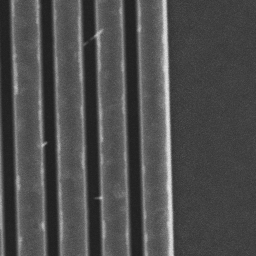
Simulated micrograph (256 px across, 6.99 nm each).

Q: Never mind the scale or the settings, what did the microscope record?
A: parallel lines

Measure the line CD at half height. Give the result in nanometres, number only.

196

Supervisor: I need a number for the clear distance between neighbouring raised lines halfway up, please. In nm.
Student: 97.8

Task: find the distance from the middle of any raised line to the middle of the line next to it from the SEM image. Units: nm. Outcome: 293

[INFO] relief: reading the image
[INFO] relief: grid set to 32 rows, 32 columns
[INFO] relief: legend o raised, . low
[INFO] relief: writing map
.oooo..ooo..ooo..oooo...........
.oooo..ooo..ooo..oooo...........
.oooo..ooo..ooo..oooo...........
..ooo..ooo..ooo..oooo...........
..ooo..ooo..ooo..oooo...........
..ooo..ooo..ooo..oooo...........
..ooo..ooo..oooo.oooo...........
..ooo..ooo..oooo.oooo...........
..ooo..ooo..oooo.oooo...........
..ooo..ooo..oooo.oooo...........
..ooo..ooo..oooo.oooo...........
..ooo..ooo..oooo..ooo...........
..ooo..ooo..oooo..ooo...........
..ooo..ooo..oooo.oooo...........
..ooo..ooo..oooo..ooo...........
..ooo..oooo.oooo..ooo...........
..ooo..oooo.oooo..ooo...........
..ooo..oooo.oooo..ooo...........
..ooo..oooo.oooo..ooo...........
..ooo..oooo.oooo..ooo...........
..ooo..oooo..ooo..ooo...........
..ooo..oooo..ooo..ooo...........
..ooo..oooo..ooo..ooo...........
..ooo..oooo..ooo..ooo...........
..oooo.oooo..ooo..ooo...........
..oooo.oooo..ooo..ooo...........
..oooo.oooo..ooo..ooo...........
..oooo.oooo..ooo..ooo...........
..oooo.oooo..ooo..ooo...........
..oooo..ooo..ooo..ooo...........
..oooo..ooo..ooo..ooo...........
..oooo..ooo..ooo..ooo...........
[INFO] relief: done